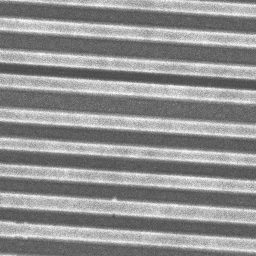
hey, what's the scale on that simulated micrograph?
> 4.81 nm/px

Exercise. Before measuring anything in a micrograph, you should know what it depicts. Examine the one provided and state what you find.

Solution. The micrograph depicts parallel lines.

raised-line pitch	140	nm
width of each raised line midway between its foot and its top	0.0702	micrometres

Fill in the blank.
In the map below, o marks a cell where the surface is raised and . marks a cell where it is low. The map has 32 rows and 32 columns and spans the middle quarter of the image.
oooooooooooooooooooooooooooooooo
.........ooooooooooooooooooooooo
.......................ooooooooo
ooo.............................
oooooooooooooooooo..............
oooooooooooooooooooooooooooooooo
oooooooooooooooooooooooooooooooo
........oooooooooooooooooooooooo
.......................ooooooooo
................................
................................
................................
oooooo..........................
ooooooooooooooooooooo...........
oooooooooooooooooooooooooooooooo
oooooooooooooooooooooooooooooooo
..............oooooooooooooooooo
.............................ooo
................................
oooo............................
ooooooooooooooooooo.............
oooooooooooooooooooooooooooooooo
.ooooooooooooooooooooooooooooooo
................oooooooooooooooo
...............................o
................................
ooooooooo.......................
oooooooooooooooooooooooo........
oooooooooooooooooooooooooooooooo
..oooooooooooooooooooooooooooooo
.................ooooooooooooooo
................................